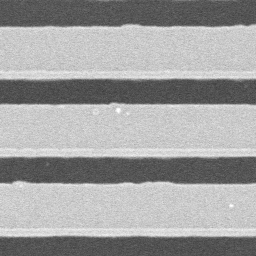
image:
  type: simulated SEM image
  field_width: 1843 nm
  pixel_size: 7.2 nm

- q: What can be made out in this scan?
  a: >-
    lines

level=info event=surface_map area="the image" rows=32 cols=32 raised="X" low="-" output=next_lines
--------------------------------
--------------------------------
--------------------------------
XXXXXXXXXXXXXXXXXXXXXXXXXXXXXXXX
XXXXXXXXXXXXXXXXXXXXXXXXXXXXXXXX
XXXXXXXXXXXXXXXXXXXXXXXXXXXXXXXX
XXXXXXXXXXXXXXXXXXXXXXXXXXXXXXXX
XXXXXXXXXXXXXXXXXXXXXXXXXXXXXXXX
XXXXXXXXXXXXXXXXXXXXXXXXXXXXXXXX
XXXXXXXXXXXXXXXXXXXXXXXXXXXXXXXX
--------------------------------
--------------------------------
--------------------------------
XXXXXXXXXXXXXXXXXXXXXXXXXXXXXXXX
XXXXXXXXXXXXXXXXXXXXXXXXXXXXXXXX
XXXXXXXXXXXXXXXXXXXXXXXXXXXXXXXX
XXXXXXXXXXXXXXXXXXXXXXXXXXXXXXXX
XXXXXXXXXXXXXXXXXXXXXXXXXXXXXXXX
XXXXXXXXXXXXXXXXXXXXXXXXXXXXXXXX
X--X---XXXXX---XXXXXXX---XXX----
--------------------------------
--------------------------------
--------------------------------
XXXXXXXXXXXXXXXXXXXXXXXXXXXXXXXX
XXXXXXXXXXXXXXXXXXXXXXXXXXXXXXXX
XXXXXXXXXXXXXXXXXXXXXXXXXXXXXXXX
XXXXXXXXXXXXXXXXXXXXXXXXXXXXXXXX
XXXXXXXXXXXXXXXXXXXXXXXXXXXXXXXX
XXXXXXXXXXXXXXXXXXXXXXXXXXXXXXXX
--------------------------------
--------------------------------
--------------------------------